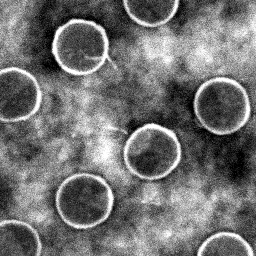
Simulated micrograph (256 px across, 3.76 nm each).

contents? raised bodies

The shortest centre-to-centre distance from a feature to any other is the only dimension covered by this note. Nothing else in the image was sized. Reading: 314 nm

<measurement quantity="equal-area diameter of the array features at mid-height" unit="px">54.7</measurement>